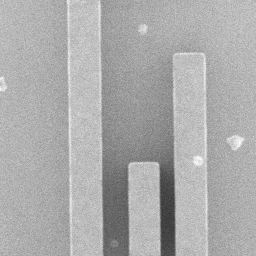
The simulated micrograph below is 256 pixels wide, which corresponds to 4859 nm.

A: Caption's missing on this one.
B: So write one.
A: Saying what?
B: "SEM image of groups of lines, slits or small figures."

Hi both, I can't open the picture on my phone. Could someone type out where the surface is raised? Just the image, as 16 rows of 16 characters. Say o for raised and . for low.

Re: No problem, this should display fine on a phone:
....oo..........
....oo..........
....oo..........
....oo.....oo...
....oo.....oo...
....oo.....oo...
....oo.....oo...
....oo.....oo...
....oo.....oo...
....oo.....oo...
....oo..oo.oo...
....oo..oo.oo...
....oo..oo.oo...
....oo..oo.oo...
....oo..oo.oo...
....oo..oo.oo...